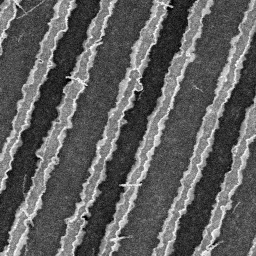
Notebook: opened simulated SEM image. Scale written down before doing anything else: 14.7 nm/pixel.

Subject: parallel lines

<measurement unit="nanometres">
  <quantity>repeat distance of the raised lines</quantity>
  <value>654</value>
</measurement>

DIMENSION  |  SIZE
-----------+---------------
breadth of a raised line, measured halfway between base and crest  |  0.194 micrometres